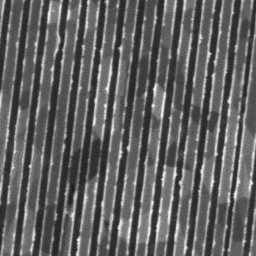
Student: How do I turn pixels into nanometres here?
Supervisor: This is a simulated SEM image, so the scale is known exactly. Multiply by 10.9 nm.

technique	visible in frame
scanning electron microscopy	parallel lines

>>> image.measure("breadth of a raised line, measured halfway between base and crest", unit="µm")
0.128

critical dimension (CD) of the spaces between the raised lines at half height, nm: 76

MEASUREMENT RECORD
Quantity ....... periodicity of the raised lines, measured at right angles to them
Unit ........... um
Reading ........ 0.208